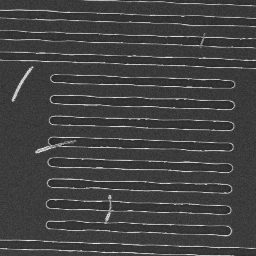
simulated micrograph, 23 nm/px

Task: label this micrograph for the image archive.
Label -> groups of lines, slits or small figures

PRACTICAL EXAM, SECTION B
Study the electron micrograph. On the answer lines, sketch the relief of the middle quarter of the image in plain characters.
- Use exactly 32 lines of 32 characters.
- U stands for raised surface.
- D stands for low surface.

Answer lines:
UUUUUUUUUUUUUUUUUUUUUUUUUUDDDDDD
UUUUUUUUUUUUUUUUUUUUUUUUUUUUUUUU
UUUUUUUUUUUUUUUUUUUUUUUUUUUUUUUU
DDDDDDDDDDDDDDDDDDDDDDDDDDDDUUUU
DDDDDDDDDDDDDDDDDDDDDDDDDDDDDDDD
UUUUUUUUUUUUUUUUUUUDDDDDDDDDDDDD
UUUUUUUUUUUUUUUUUUUUUUUUUUUUUUUU
UUUUUUUUUUUUUUUUUUUUUUUUUUUUUUUU
DDDDDDDDDDDDDDDDDDDDDUUUUUUUUUUU
DDDDDDDDDDDDDDDDDDDDDDDDDDDDDDDD
UUUUUUUUUUUDDDDDDDDDDDDDDDDDDDDD
UUUUUUUUUUUUUUUUUUUUUUUUUUUUUUUU
UUUUUUUUUUUUUUUUUUUUUUUUUUUUUUUU
DDDDDDDDDDDDDDDUUUUUUUUUUUUUUUUU
DDDDDDDDDDDDDDDDDDDDDDDDDDDDDDDD
UUUUUUDDDDDDDDDDDDDDDDDDDDDDDDDD
UUUUUUUUUUUUUUUUUUUUUUUUUUUUUUUU
UUUUUUUUUUUUUUUUUUUUUUUUUUUUUUUU
DDDDDDDDDUUUUUUUUUUUUUUUUUUUUUUU
DDDDDDDDDDDDDDDDDDDDDDDDDDDDDDDD
DDDDDDDDDDDDDDDDDDDDDDDDDDDDDDDD
UUUUUUUUUUUUUUUUUUUUUUUUUUUUUUUD
UUUUUUUUUUUUUUUUUUUUUUUUUUUUUUUU
UUUUUUUUUUUUUUUUUUUUUUUUUUUUUUUU
DDDDDDDDDDDDDDDDDDDDDDDDDDDUUUDU
DDDDDDDDDDDDDDDDDDDDDDDDDDDDDDDD
UUUUUUUUUUUUUUUUUUUUUUUUUDDDDDDD
UUUUUUUUUUUUUUUUUUUUUUUUUUUUUUUU
UUUUUUUUUUUUUUUUUUUUUUUUUUUUUUUU
DDDDDDDDDDDDDDDDDDDDDUUUUUUUUUUU
DDDDDDDDDDDDDDDDDDDDDDDDDDDDDDDD
UUUUUUUUUUUUUUUDDDDDDDDDDDDDDDDD